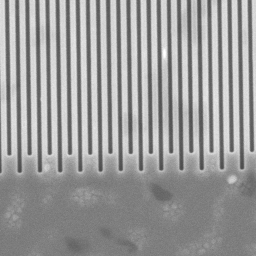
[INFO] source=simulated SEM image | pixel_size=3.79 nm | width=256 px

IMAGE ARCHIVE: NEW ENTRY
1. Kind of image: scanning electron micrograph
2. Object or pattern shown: parallel lines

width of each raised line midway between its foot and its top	23.2	nm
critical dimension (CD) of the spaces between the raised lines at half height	16.6	nanometers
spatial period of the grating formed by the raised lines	0.0383	microns